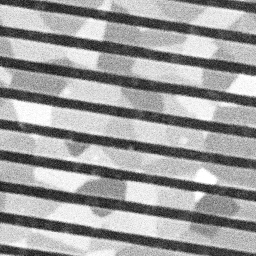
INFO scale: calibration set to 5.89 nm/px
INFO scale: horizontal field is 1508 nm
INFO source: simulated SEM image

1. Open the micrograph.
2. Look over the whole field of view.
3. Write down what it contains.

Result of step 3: parallel lines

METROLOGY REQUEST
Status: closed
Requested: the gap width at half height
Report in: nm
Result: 69.8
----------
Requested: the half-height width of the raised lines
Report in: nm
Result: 113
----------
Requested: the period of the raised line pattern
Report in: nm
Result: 182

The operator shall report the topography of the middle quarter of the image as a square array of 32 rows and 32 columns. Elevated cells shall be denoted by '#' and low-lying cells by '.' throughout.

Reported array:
..############################..
........########################
..............##################
#..................#############
######...................#######
############....................
##################..............
#########################.......
.###############################
.......#########################
..............##################
##..................############
########..................######
##############..................
#####################...........
#########################.......
..##############################
........########################
...............#################
###..................###########
#########..................#####
##############..................
#####################...........
############################....
....############################
...........#####################
................################
###...................##########
##########...................###
#################...............
########################........
############################....